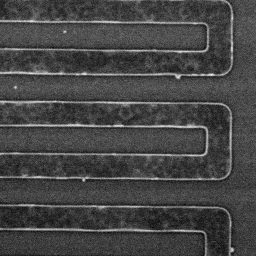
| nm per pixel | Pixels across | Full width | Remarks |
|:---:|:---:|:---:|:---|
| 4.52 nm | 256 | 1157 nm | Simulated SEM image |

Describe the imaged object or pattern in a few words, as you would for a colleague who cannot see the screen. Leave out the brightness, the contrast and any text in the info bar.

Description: groups of lines, slits or small figures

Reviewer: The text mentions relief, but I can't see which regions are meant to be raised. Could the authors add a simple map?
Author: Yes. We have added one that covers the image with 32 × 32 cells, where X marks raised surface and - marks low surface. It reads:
XXXXXXXXXXXXXXXXXXXXXXXXXXXXX---
XXXXXXXXXXXXXXXXXXXXXXXXXXXXX---
XXXXXXXXXXXXXXXXXXXXXXXXXXXXX---
--------------------------XXX---
--------------------------XXX---
--------------------------XXX---
XXXXXXXXXXXXXXXXXXXXXXXXXXXXX---
XXXXXXXXXXXXXXXXXXXXXX-XXXXXX---
XXXX-XXXXXXXXXXXXXXXXXXXXXXXX---
----------------------X---------
--------------------------------
--------------------------------
--------------------------------
XXXXXXXXXXXXXXXXXXXXXXXXXXXX----
XXXXXXXXXXXXXXXXXXXXXXXXXXXXX---
XXXXXXXXXXXXXXXXXXXXXXXXXXXXX---
--------------------------XXX---
--------------------------XXX---
--------------------------XXX---
XXXXXXXXXXXXXXXXXXXXXXXXXXXXX---
XXXXXXXXXXXXXXXXXXXXXXXXXXXXX---
XXXXXXXXXXXXXXXXXXXXXXXXXX-XX---
--------------------------------
--------------------------------
--------------------------------
--------------------------------
XXXXXXXXXXXXXXXXXXXXXXXXXXXX----
XXXXXXXXXXXXXXXXXXXXXXXXXXXXX---
XXXXXXXXXXXXXXXXXXXXXXXXXXXXX---
--------------------------XXX---
--------------------------XXX---
--------------------------XXX---